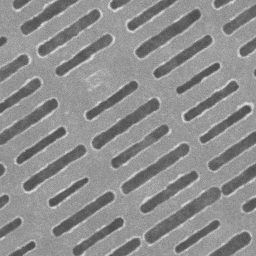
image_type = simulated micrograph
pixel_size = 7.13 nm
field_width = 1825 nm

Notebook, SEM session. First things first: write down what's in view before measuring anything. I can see a regular array of holes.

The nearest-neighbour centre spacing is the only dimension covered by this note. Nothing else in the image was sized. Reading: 192 nm